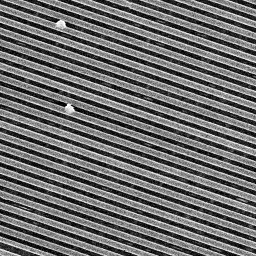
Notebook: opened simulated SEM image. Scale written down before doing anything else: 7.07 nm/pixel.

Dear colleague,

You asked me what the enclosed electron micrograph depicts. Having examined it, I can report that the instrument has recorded parallel lines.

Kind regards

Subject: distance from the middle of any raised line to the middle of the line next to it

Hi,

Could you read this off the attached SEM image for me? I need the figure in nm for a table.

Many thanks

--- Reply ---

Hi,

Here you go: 77.8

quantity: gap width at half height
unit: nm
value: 36.8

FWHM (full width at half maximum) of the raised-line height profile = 42.7 nanometres